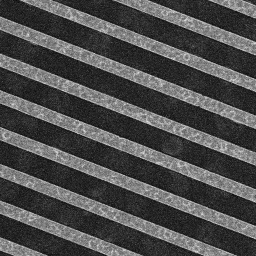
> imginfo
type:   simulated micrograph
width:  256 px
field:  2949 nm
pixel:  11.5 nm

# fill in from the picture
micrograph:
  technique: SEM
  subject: parallel lines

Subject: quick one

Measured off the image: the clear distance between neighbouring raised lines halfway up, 260 nanometres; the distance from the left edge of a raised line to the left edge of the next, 394 nm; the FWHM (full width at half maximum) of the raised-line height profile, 130 nanometres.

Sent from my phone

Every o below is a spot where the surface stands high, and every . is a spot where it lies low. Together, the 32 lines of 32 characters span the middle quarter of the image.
........oooooooo...............o
..........oooooooo..............
.............oooooooo...........
...............oooooooo.........
oo................oooo.ooo......
o.ooo...............ooooooooo...
ooooooo................oooooooo.
..oooooooo................oooooo
....oooooooo................oooo
.......oooooooo................o
..........oooooooo..............
............oooooooo............
...............oooooooo.........
oo...............oooooooo.......
oooo................oooooooo....
ooooooo...............ooooooooo.
.oooooooo................ooooooo
....oooooooo................oooo
......oooooooo................oo
.........oooooooo........oooo...
............oooooooo.....oooo...
..............oooooooo...oooo...
o................oooooooo.oo....
oooo...............oooooooo.....
oooooo................oooooooo..
.oo.ooooo...............oooooooo
....ooooooo................ooooo
......oooooooo................oo
.........ooooooo................
............ooooooo.............
..............oooooooo..........
.......oo........ooooooo........